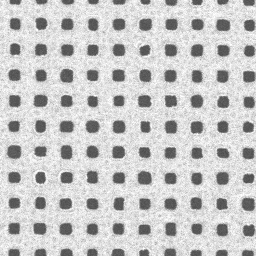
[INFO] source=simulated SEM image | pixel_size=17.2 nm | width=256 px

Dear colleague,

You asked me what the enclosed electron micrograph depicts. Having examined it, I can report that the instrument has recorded a regular array of holes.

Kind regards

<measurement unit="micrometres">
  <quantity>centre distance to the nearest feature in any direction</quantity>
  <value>0.437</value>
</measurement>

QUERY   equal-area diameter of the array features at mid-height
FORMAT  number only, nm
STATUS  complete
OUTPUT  220